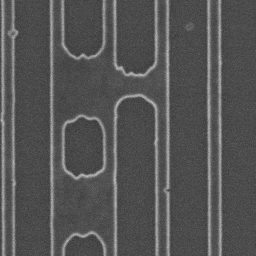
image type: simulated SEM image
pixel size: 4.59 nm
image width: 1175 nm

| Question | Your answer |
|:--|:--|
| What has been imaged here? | parallel lines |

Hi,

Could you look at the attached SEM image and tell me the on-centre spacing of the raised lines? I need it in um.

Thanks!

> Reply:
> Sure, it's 0.237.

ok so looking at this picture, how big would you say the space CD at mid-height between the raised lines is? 184 nm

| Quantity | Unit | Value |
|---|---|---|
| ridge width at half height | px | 11.8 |